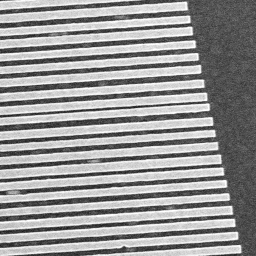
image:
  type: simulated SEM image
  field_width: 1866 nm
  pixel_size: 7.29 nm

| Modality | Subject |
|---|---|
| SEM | parallel lines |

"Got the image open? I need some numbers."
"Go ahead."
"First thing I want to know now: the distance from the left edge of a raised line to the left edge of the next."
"0.0947 µm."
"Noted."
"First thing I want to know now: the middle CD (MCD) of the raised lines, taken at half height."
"0.0527 microns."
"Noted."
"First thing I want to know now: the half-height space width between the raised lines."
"0.0418 um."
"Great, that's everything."